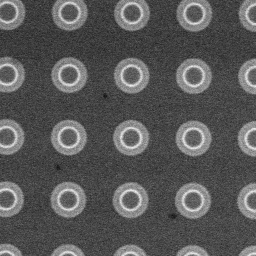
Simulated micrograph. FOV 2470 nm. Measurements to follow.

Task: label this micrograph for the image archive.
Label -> an array of small figures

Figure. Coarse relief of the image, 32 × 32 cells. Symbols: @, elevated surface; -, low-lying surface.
@@@----@@@@----@@@----@@@@----@@
@@@----@@@@---@@@@@---@@@@----@@
@@@----@@@@---@@@@@---@@@@----@@
@@------@@-----@@@-----@@@-----@
--------------------------------
--------------------------------
--------------------------------
@@------@@-----@@------@@------@
@@@----@@@@---@@@@----@@@@----@@
@@@---@@@@@---@@@@@---@@@@----@@
@@@----@@@@----@@@----@@@@----@@
--------@-------@------@@------@
--------------------------------
--------------------------------
--------------------------------
@@-----@@@-----@@@-----@@------@
@@@----@@@@---@@@@----@@@@----@@
@@@---@@@@@---@@@@@---@@@@----@@
@@-----@@@-----@@@----@@@@----@@
-------------------------------@
--------------------------------
--------------------------------
--------------------------------
@@-----@@@-----@@@-----@@@----@@
@@@---@@@@@---@@@@----@@@@----@@
@@@---@@@@@---@@@@----@@@@----@@
@@-----@@@-----@@@----@@@@----@@
--------------------------------
--------------------------------
--------------------------------
--------------------------------
@@-----@@@-----@@@----@@@@----@@